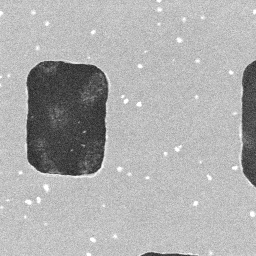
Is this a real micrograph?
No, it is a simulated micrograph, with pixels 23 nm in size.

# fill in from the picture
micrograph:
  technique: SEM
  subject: holes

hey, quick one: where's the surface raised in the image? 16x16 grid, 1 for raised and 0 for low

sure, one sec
1111111111111111
1111111111111111
1111111111111111
1111111111111111
1100001111111110
1100000111111110
1100000111111110
1100000111111110
1100000111111110
1100000111111110
1100001111111110
1111111111111111
1111111111111111
1111111111111111
1111111111111111
1111111111111111